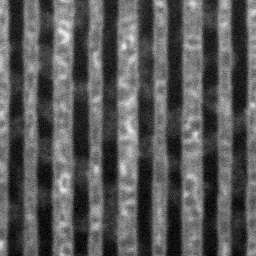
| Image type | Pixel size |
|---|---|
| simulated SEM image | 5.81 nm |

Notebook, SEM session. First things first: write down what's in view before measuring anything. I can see parallel lines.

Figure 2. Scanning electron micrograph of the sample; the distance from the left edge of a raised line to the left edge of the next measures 185 nanometres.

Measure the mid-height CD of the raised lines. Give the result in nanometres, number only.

112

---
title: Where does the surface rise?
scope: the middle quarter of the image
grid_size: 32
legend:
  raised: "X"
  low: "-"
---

--XXXX---XXXXX----XXXXX---XXXX--
--XXXX---XXXXX----XXXXX---XXXX--
--XXXX---XXXXX----X--XX---XXXX--
--XXXX---XXXXX----XX-XX---XXXX--
--XXXX---XXXXX----XXXXX---XXXX--
---------XXXXX----XXXXX--XXXXX--
------X--XXXXX----X-XXX--XXXXX--
--X---X--XXXXX----XXXXX--XXXXX--
--XXXXX--XXXXX----XXXXX--XXXXX--
--XXXXX--XXXXX----XXXXX--XXXXX--
--XXXXX--XXXXX----XXXXX---XXXX--
--XXXXX--XXXXX----XXXXX--XXXXX--
--XXXXX--XXXXX----XXXXX--XXXXX--
--XXXXX--XXXXX----XXXXX--XXXXX--
--XXXXX--XXXXX----XXXXX--XXXXX--
--XXXXX--XXXXX----XXXXX--XXXXX--
--XXXXX--XXXXX----XXXXX--XXXXX--
--XXXXX--XXXXX----XXXXX--XXXXX--
--XXXXX--XXXXX----XXXXX--XXXXX--
--XXXXX--XXXXX----XXXXX--XXXXX--
--XXXXX--XXXXX----XXXXX--XXXXX--
--XXXXX--XXXXX----XXXX---XXXXX--
--XXXXX--XXXXX----XXXXX--XXXXX--
--XXXXX--XXXXX----XXXXX--X-XXX--
--XXXXX--XXXXX----XXXX---X-XXX--
--XXXXX--XXXXX----XXXX---XXXXX--
--XXXXX--XXXXX----XXXX---XXXXX--
--XXXXX--XXXXX----XXXXX--XXXXX--
--XXXXX--XXXXX----XXXXX--XXXXX--
--XXXXX--XXXXX----XXXX---XXXXX--
--XXXXX--XXXXX----XXXX---XXXXX--
--XXXXX--XXXXX----XXXX----XXXX--